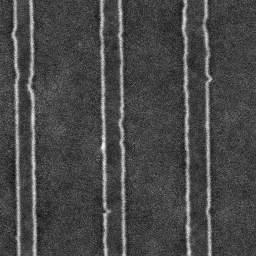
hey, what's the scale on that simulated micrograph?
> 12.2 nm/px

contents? one or a few lines or trenches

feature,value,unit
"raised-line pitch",1050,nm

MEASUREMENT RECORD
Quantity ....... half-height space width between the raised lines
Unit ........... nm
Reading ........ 832